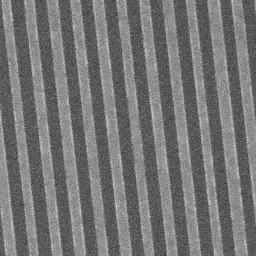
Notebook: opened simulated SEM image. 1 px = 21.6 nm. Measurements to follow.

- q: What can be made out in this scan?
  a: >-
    parallel lines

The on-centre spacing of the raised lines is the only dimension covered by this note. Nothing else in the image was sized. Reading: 495 nanometers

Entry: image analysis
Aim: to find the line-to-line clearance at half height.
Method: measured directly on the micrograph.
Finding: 0.284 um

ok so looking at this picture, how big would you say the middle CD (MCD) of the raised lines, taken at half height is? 9.81 pixels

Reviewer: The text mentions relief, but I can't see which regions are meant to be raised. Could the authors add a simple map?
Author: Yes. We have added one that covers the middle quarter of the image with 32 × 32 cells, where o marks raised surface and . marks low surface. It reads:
....oo...oo....oo....oo....oo...
....oo...ooo...oo....oo....oo...
....oo...ooo...oo....oo....oo...
....oo....oo...oo....oo....oo...
....oo....oo....oo...oo....oo...
o...oo....oo....oo...ooo...oo...
o...oo....oo....oo...ooo...ooo..
o...oo....oo....oo....oo...ooo..
o...ooo...oo....oo....oo...ooo..
o....oo...ooo...oo....oo....oo..
o....oo...ooo...oo....oo....oo..
o....oo...ooo...oo....oo....oo..
o....oo...ooo...oo....oo....oo..
o....oo....oo....oo...oo....oo..
oo...oo....oo....oo...ooo...oo..
oo...oo....oo....oo...ooo...oo..
oo...oo....oo....oo...ooo...ooo.
oo...ooo...oo....oo....oo...ooo.
oo....oo...oo....oo....oo....oo.
oo....oo...ooo...oo....oo....oo.
oo....oo...ooo...oo....oo....oo.
oo....oo...ooo...oo....oo....oo.
oo....oo....oo....oo...oo....oo.
ooo...oo....oo....oo...ooo...oo.
ooo...oo....oo....oo...ooo...oo.
ooo...oo....oo....oo...ooo...ooo
ooo...ooo...oo....oo....oo...ooo
.oo....oo...ooo...oo....oo...ooo
.oo....oo...ooo...oo....oo....oo
.oo....oo...ooo...oo....oo....oo
.oo....oo...ooo...oo....oo....oo
.oo....oo....oo....oo...oo....oo